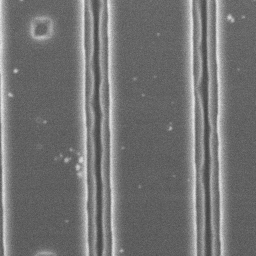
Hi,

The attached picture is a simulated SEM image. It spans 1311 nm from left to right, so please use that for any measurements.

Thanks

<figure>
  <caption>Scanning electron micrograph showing wiring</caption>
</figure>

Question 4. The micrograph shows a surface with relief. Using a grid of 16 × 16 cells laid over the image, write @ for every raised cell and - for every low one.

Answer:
@@@@@--@@@@@--@@
@@@@@--@@@@@--@@
@@@@@--@@@@@--@@
@@@@@--@@@@@--@@
@@@@@--@@@@@--@@
@@@@@--@@@@@--@@
@@@@@--@@@@@--@@
@@@@@--@@@@@--@@
@@@@@--@@@@@--@@
@@@@@--@@@@@--@@
@@@@@--@@@@@--@@
@@@@@--@@@@@--@@
@@@@@--@@@@@--@@
@@@@@--@@@@@--@@
@@@@@--@@@@@--@@
@@@@@@-@@@@@--@@